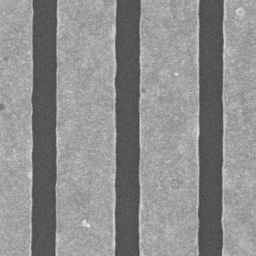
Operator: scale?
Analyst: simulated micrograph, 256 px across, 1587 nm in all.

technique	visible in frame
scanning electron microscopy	wiring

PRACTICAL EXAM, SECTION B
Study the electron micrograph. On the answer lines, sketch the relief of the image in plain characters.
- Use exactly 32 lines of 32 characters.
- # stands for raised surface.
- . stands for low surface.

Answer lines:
####...#######....#######...####
####...#######....#######...####
####...#######....#######...####
####...#######....#######...####
####...#######....#######...####
####...#######....#######...####
####...#######....#######...####
####...#######....#######...####
####...#######....#######...####
####...#######....#######...####
####...#######....#######...####
####...#######....#######...####
####...#######...########...####
####...#######...########...####
####...#######....#######...####
####...#######....#######...####
####...#######....#######...####
####...#######....#######...####
####...#######....#######...####
####...#######....#######...####
####...#######...########...####
####...#######...########...####
####...#######...########...####
####...#######....#######...####
####...#######....#######...####
####...#######...########...####
####...#######...########...####
####...#######...########...####
####...#######...########...####
####...#######...########...####
####...#######...########...####
####...#######....#######...####